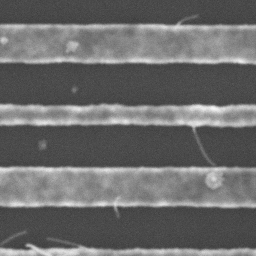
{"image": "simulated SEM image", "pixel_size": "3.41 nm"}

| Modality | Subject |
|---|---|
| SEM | lines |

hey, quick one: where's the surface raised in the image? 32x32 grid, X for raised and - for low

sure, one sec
--------------------------------
--------------------------------
--------------------------------
XXXXXXXXXXXXXXXXXXXXXXXXXXXXXXXX
XXXXXXXXXXXXXXXXXXXXXXXXXXXXXXXX
XXXXXXXXXXXXXXXXXXXXXXXXXXXXXXXX
XXXXXXXXXXXXXXXXXXXXXXXXXXXXXXXX
XXXXXXXXXXXXXXXXXXXXXXXXXXXXXXXX
--------------------------------
--------------------------------
--------------------------------
--------------------------------
--------------------------------
XXXXXXXXXXXXXXXXXXXXXXXXXXXXXXXX
XXXXXXXXXXXXXXXXXXXXXXXXXXXXXXXX
XXXXXXXXXXXXXXXXXXXXXXXXXXXXXXXX
--------------------------------
--------------------------------
--------------------------------
--------------------------------
--------------------------------
XXXXXXXXXXXXXXXXXXXXXXXXXXXXXXXX
XXXXXXXXXXXXXXXXXXXXXXXXXXXXXXXX
XXXXXXXXXXXXXXXXXXXXXXXXXXXXXXXX
XXXXXXXXXXXXXXXXXXXXXXXXXXXXXXXX
XXXXXXXXXXXXXXXXXXXXXXXXXXXXXXXX
--------------------------------
--------------------------------
--------------------------------
--------------------------------
--------------------------------
XXXXXXXXXXXXXXXXXXXXXXXXXXXXXXXX